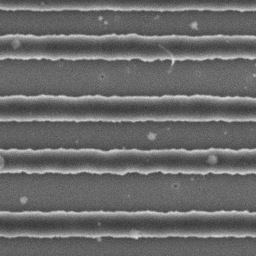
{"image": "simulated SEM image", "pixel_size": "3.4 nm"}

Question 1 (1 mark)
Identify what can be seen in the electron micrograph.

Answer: lines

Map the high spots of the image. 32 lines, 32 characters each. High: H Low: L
HHHHHHHHHHHHHHHHHHHHHHHHHHHHHHHH
LLLLLLLLLLLLLLLLLLLLLLLLLLLLLLLL
LLLLLLLLLLLLLLLLLLLLLLLLLLLLLLLL
LLLLLLLLLLLLLLLLLLLLLLLLLLLLLLLL
LHHHLLHHLHHLLHHHHLLLLHLLLLLHLLLL
HHHHHHHHHHHHHHHHHHHHHHHHHHHHHHHH
HHHHHHHHHHHHHHHHHHHHHHHHHHHHHHHH
LLLLLLLLLLLLLLLLLLHLLHLLLLLLLLLL
LLLLLLLLLLLLLLLLLLLLLLLLLLLLLLLL
LLLLLLLLLLLLLLLLLLLLLLLLLLLLLLLL
LLLLLLLLLLLLLLLLLLLLLLLLLLLLLLLL
LLLLLLLLLLLLLLLLLLLLLLLLLLLLLLLL
HHHHHHHHHHHHHHHHHHHHHHHHHHHHHHHH
HHHHHHHHHHHHHHHHHHHHHHHHHHHHHHHH
HHHHHHHHHHHHHHHHHHHHHHHHHHHHHHHH
LLLLLLLLLLLLLLLLLLLLLLLLLLLLLLLL
LLLLLLLLLLLLLLLLLLLLLLLLLLLLLLLL
LLLLLLLLLLLLLLLLLLLLLLLLLLLLLLLL
LLLLLLLLLLLLLLLLLLLLLLLLLLLLLLLL
HHHHHHHHHHHHHHHHHHHHHHHHHHHHHHHH
HHHHHHHHHHHHHHHHHHHHHHHHHHHHHHHH
HHHHHHHHHHLHHHHHHHHLHHHHHHHHHHHH
LLLLLLLLLLLLLLLLLLLLLLLLLLLLLLLL
LLLLLLLLLLLLLLLLLLLLLLLLLLLLLLLL
LLLLLLLLLLLLLLLLLLLLLLLLLLLLLLLL
LLLLLLLLLLLLLLLLLLLLLLLLLLLLLLLL
HHLHHLHHHHHHHHHHLHHHLHHHHHLHHHHL
HHHHHHHHHHHHHHHHHHHHHHHHHHHHHHHH
HHHHHHHHHHHHHHHHHHHHHHHHHHHHHHHH
HHLHHHHHHLHHHLHHHHHHHLHHHHHHHHHH
LLLLLLLLLLLLLLLLLLLLLLLLLLLLLLLL
LLLLLLLLLLLLLLLLLLLLLLLLLLLLLLLL